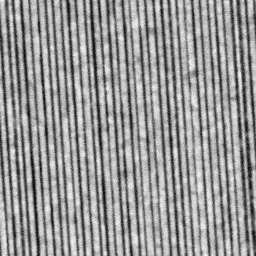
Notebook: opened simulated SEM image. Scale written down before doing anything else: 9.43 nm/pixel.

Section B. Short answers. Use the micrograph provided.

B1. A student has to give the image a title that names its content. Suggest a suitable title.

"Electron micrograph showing parallel lines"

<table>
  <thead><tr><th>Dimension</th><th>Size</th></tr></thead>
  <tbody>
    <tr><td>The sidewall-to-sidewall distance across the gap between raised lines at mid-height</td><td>3.49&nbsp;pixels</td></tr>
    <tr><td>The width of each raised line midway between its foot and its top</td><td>41.1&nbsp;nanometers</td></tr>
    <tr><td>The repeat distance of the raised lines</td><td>0.0727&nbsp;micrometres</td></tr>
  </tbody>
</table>